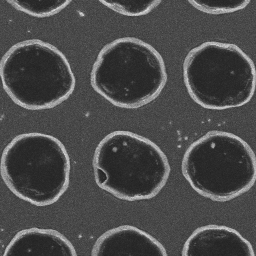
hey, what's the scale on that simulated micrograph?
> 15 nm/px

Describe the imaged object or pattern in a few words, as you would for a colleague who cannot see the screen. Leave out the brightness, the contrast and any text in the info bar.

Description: raised bodies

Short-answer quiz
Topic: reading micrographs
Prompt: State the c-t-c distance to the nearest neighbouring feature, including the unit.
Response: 1380 nanometers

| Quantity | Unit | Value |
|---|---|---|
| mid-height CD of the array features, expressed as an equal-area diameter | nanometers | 1020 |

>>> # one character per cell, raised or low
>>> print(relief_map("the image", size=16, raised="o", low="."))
.ooo...oo....oo.
................
................
oooo..oooo..ooo.
oooo..oooo..oooo
oooo..oooo..oooo
.oo....oo....oo.
................
.oo....o.....o..
oooo..oooo..oooo
oooo..oooo..oooo
.ooo..oooo..oooo
..o.............
................
..o....oo...ooo.
.ooo..oooo..oooo